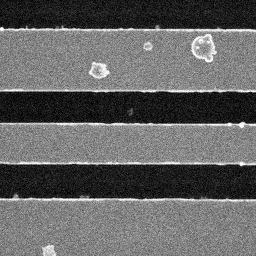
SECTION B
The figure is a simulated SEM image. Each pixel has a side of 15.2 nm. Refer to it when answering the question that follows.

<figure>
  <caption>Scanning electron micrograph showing lines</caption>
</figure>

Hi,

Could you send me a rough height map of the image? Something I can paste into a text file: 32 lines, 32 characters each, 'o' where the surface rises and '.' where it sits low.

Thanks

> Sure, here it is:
................................
................................
................................
................................
oooooooooooooooooooooooooooooooo
oooooooooooooooooooooooooooooooo
oooooooooooooooooooooooooooooooo
oooooooooooooooooooooooooooooooo
oooooooooooooooooooooooooooooooo
oooooooooooooooooooooooooooooooo
oooooooooooooooooooooooooooooooo
................................
................................
................................
................................
ooooooooooooo.ooooo.........o.o.
oooooooooooooooooooooooooooooooo
oooooooooooooooooooooooooooooooo
oooooooooooooooooooooooooooooooo
oooooooooooooooooooooooooooooooo
...........................oo.oo
................................
................................
................................
................................
oooooooooooooooooooooooooooooooo
oooooooooooooooooooooooooooooooo
oooooooooooooooooooooooooooooooo
oooooooooooooooooooooooooooooooo
oooooooooooooooooooooooooooooooo
oooooooooooooooooooooooooooooooo
oooooooooooooooooooooooooooooooo